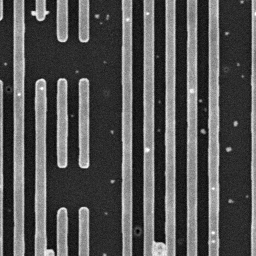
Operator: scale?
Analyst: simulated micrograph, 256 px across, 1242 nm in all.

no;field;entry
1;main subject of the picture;wiring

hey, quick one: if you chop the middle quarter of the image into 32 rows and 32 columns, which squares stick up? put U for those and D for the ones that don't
DDDDDDDDDDDDDDDUUDDDUUDDDDUUDDDU
DDDDDDDDDDDDDDDUUDDDUUDDDDUUDDDU
DDDDDDDDDDDDDDDUUDDDUUDDDDUUDDDU
DDDDDDDDDDDDDDDUUDDDUUDDDDUUDDDU
UDDDUUDDDDDDDDDUUDDDUUDDDDUUDDDU
UDDDUUDDDDDDDDDUUDDDUUDDDDUUDDDU
UDDDUUDDDDDDDDDUUDDDUUDDDDUUDDDU
UDDDUUDDDDDDDDDUUDDDUUDDDDUUDDDU
UDDDUUDDDDDDDDDUUDDDUUDDDDUUDDDU
UDDDUUDDDDDDDDDUUDDDUUDDDDUUDDDU
UDDDUUDDDDDDDDDUUDDDUUDDDDUUDDDU
UDDDUUDDDDDDDDDUUDDDUUDDDDUUDDDU
UDDDUUDDDDDDDDDUUDDDUUDDDDUUDDDU
UDDDUUDDDDDDDDDUUDDDUUDDDDUUDDDU
UDDDUUDDDDDDDDDUUDDDUUDDDDUUDDDU
UDDDUUDDDDDDDDDUUDDDUUDDDDUUDDDU
UDDDUUDDDDDDDDDUUDDDUUDDDDUUDDDU
UDDDUUDDDDDDDDDUUDDDUUDDDUUUDDDU
UDDDUUDDDDDDDDDUUDDDUUDDDUUUDDDU
UDDDUUDDDDDDDDDUUDDDUUDDDUUUDDDU
UDDDUUDDDDDDDDDUUDDDUUDDDUUUDDDU
UDDDUUDDDDDDDDDUUDDDUUDDDDUUDDDU
UDDDUUDDDDDDDDDUUDDDUUDDDDUUDDDU
UDDDUUDDDDDDDDDUUDDDUUDDDDUUDDDU
UDDDUUDDDDDDDDDUUDDDUUDDDDUUDDDU
UDDDUUDDDDDDDDDUUDDDUUDDDDUUDDDU
DDDDDDDDDDDDDDDUUDDDUUDDDUUUDDDU
DDDDDDDDDDDDDDDUUDDDUUDDDUUUDDDU
DDDDDDDDDDDDDDDUUDDDUUDDDDUUDDDU
DDDDDDDDDDDDDDDUUDDDUUDDDDUUDDDU
DDDDDDDDDDDDDDDUUDDDUUDDDDUUDDDU
DDDDDDDDDDDDDDDUUDDDUUDDDDUUDDDU